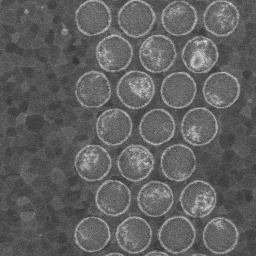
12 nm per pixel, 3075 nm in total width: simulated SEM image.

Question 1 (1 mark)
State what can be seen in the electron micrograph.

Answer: a regular array of holes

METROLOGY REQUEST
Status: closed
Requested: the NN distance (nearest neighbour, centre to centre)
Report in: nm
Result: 500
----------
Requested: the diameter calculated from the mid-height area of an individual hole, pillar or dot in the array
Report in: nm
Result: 411